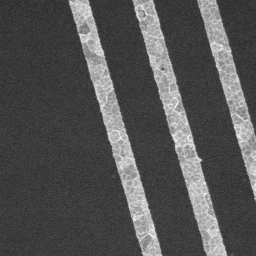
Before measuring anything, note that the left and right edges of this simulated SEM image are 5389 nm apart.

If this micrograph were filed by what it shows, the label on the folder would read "one or a few lines or trenches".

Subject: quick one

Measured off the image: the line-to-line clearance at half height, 915 nm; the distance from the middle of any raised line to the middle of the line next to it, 1290 nanometers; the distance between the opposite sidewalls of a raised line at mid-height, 0.351 um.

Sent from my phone